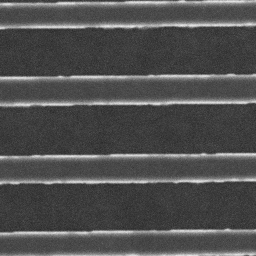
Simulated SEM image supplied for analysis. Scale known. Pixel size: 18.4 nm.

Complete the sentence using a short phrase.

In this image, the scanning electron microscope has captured lines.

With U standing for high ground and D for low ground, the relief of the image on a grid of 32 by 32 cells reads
UUUUUUUUUUUUUUUUUUUUUUUUUUUUUUUU
UUUUUUUUUUUUUUUUUUUUUUUUUUUUUUUU
UUUUUUUUUUUUUUUUUUUUUUUUUUUUUUUU
DDDDDDDDDDDDDDDDDDDDDDDDDDDDDDDD
DDDDDDDDDDDDDDDDDDDDDDDDDDDDDDDD
DDDDDDDDDDDDDDDDDDDDDDDDDDDDDDDD
DDDDDDDDDDDDDDDDDDDDDDDDDDDDDDDD
DDDDDDDDDDDDDDDDDDDDDDDDDDDDDDDD
DDDDDDDDDDDDDDDDDDDDDDDDDDDDDDDD
DDDDDDDDDDDDDDDDDDDDUUUUUUUUUUUU
UUUUUUUUUUUUUUUUUUUUUUUUUUUUUUUU
UUUUUUUUUUUUUUUUUUUUUUUUUUUUUUUU
UUUUUUUUUUUUUUUUUUUUUUUUUUUUUUUU
DDDDDDDDDDDDDDDDDDDDDDDDDDDDDDDD
DDDDDDDDDDDDDDDDDDDDDDDDDDDDDDDD
DDDDDDDDDDDDDDDDDDDDDDDDDDDDDDDD
DDDDDDDDDDDDDDDDDDDDDDDDDDDDDDDD
DDDDDDDDDDDDDDDDDDDDDDDDDDDDDDDD
DDDDDDDDDDDDDDDDDDDDDDDDDDDDDDDD
DDDDUUUUUUUUUUUUUUUUUUUUUUUUUUUU
UUUUUUUUUUUUUUUUUUUUUUUUUUUUUUUU
UUUUUUUUUUUUUUUUUUUUUUUUUUUUUUUU
UUUUUUUUUUUUUUUUUUUUUUUUUUUUUUUU
DDDDDDDDDDDDDDDDDDDDDDDDDDDDDDDD
DDDDDDDDDDDDDDDDDDDDDDDDDDDDDDDD
DDDDDDDDDDDDDDDDDDDDDDDDDDDDDDDD
DDDDDDDDDDDDDDDDDDDDDDDDDDDDDDDD
DDDDDDDDDDDDDDDDDDDDDDDDDDDDDDDD
DDDDDDDDDDDDDDDDDDDDDDDDDDDDDDDD
UUUUUUUUUUUUUUUUUUUUUUUUUUUUUUUU
UUUUUUUUUUUUUUUUUUUUUUUUUUUUUUUU
UUUUUUUUUUUUUUUUUUUUUUUUUUUUUUUU